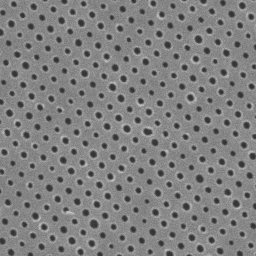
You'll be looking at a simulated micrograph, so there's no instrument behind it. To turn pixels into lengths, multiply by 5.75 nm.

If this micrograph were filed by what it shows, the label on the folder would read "a regular array of holes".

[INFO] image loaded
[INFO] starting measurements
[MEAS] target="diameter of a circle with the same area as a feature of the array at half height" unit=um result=0.0349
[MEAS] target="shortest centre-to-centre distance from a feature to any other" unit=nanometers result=78.9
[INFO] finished